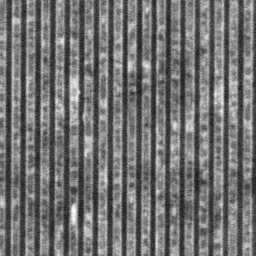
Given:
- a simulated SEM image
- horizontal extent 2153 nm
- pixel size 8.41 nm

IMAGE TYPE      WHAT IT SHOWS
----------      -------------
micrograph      parallel lines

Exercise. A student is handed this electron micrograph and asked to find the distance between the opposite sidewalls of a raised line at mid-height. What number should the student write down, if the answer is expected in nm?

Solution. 65.1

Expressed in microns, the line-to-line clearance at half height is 0.0567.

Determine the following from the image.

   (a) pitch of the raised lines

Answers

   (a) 122 nm